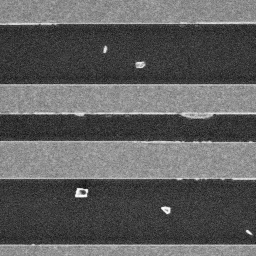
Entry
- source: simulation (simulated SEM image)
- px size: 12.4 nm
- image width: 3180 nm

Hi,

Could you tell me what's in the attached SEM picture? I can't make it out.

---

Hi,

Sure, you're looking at lines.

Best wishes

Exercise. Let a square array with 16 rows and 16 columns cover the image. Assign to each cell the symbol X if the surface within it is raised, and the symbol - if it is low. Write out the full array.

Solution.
XXXXXXXXXXXXXXXX
----------------
----------------
----------------
----------------
XXXXXXXXXXXXXXXX
XXXXXXXXXXXXXXXX
----------------
----------------
XXXXXXXXXXXXXXXX
XXXXXXXXXXXXXXXX
----------------
----------------
----------------
----------------
XXXXXXXXXXXXXXXX